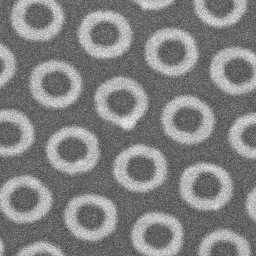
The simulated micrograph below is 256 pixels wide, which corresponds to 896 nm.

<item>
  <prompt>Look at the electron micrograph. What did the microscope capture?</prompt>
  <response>a regular array of ring-shaped raised bodies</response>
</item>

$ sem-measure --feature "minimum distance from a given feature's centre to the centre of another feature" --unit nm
239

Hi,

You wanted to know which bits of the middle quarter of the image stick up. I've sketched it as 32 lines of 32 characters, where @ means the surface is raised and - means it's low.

@---------------------@@@---@@@@
@@@--------------------@@@@@@@@-
-@@@---------------------@@@@---
--@@---------@@-----------------
--@@-------@@@@@@@--------------
--@@------@@@@@@@@@-------------
--@@-----@@@----@@@@------------
-@@@----@@@-------@@------------
@@@-----@@--------@@---------@@@
@@------@@--------@@@------@@@@@
--------@@@-------@@@-----@@@---
--------@@@-------@@-----@@@----
---------@@@-----@@------@@-----
----------@@@@@@@@@------@@-----
------------@@@@@@-------@@-----
---------------@@--------@@-----
@@@@@--------------------@@@----
@@@@@@@-------------------@@@@@-
----@@@@-------------------@@@@@
-----@@@----------------------@@
------@@------------------------
------@@--------@@@@@@@---------
------@@@-----@@@@@@@@@@--------
-----@@@@----@@@------@@@-------
----@@@@-----@@@-------@@-------
@@@@@@@------@@--------@@-------
@@@@@@-------@@--------@@------@
-------------@@@-------@@-----@@
-------------@@@------@@@-----@@
--------------@@@@---@@@-----@@@
---------------@@@@@@@@------@@@
-----------------@@@@--------@@@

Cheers